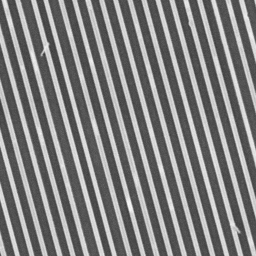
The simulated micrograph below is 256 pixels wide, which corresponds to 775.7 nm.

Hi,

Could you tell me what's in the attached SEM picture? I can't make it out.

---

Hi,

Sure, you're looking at parallel lines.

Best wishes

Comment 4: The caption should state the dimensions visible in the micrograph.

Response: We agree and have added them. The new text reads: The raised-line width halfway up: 13.9 nm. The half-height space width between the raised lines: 28.1 nanometres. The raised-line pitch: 0.0407 microns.